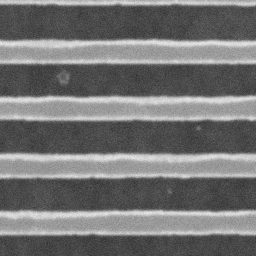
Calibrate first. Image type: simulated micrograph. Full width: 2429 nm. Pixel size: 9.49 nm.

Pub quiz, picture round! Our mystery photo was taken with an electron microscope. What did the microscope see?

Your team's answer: lines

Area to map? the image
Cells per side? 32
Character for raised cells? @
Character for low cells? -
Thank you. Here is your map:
--------@-@@@---@@@@@---@@@@@@@@
--------------------------------
--------------------------------
--------------------------------
--------------------------------
@@@@@@@@@@@@@@@@@@@@@@@@@@@@@@@@
@@@@@@@@@@@@@@@@@@@@@@@@@@@@@@@@
@@@@@@@@@@@@@@@@@@@@@@@@@@@@@@@@
--------------------------------
--------------------------------
--------------------------------
--------------------------------
@@-@@@@@@@-@@@@@@-----@@@@--@@@@
@@@@@@@@@@@@@@@@@@@@@@@@@@@@@@@@
@@@@@@@@@@@@@@@@@@@@@@@@@@@@@@@@
--------------------------------
--------------------------------
--------------------------------
--------------------------------
--------------------------------
@@@@@@@@@@@@@@@@@@@@@@@@@@@@@@@@
@@@@@@@@@@@@@@@@@@@@@@@@@@@@@@@@
--------------------------------
--------------------------------
--------------------------------
--------------------------------
-------------------@-----------@
@@@@@@@@@@@@@@@@@@@@@@@@@@@@@@@@
@@@@@@@@@@@@@@@@@@@@@@@@@@@@@@@@
--------------------------------
--------------------------------
--------------------------------